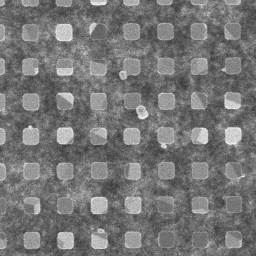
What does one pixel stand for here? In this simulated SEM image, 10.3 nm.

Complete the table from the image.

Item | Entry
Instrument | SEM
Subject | a regular array of raised bodies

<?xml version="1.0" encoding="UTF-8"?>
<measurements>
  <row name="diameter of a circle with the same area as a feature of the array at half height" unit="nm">183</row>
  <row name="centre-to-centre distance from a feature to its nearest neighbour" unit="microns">0.344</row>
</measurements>